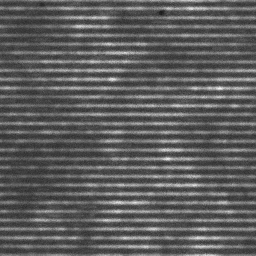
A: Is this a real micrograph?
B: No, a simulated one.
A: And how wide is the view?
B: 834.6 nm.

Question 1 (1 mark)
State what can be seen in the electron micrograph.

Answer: parallel lines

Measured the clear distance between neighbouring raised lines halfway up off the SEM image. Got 23.2 nm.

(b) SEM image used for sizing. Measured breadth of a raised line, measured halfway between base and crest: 6.1 nm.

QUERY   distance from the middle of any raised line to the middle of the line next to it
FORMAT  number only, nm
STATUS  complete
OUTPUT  28.8